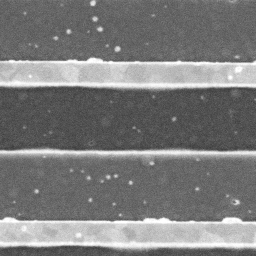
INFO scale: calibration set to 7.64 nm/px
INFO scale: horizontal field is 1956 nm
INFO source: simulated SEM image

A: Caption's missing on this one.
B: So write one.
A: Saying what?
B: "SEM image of lines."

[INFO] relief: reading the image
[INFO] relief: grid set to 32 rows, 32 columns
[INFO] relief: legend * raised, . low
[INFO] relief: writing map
********************************
********************************
********************************
********************************
********************************
********************************
********************************
********************************
********************************
********************************
....****************************
................................
................................
................................
................................
................................
................................
................................
................................
********************************
********************************
********************************
********************************
********************************
********************************
********************************
********************************
********************************
********************************
********************************
.................*..*****.******
................................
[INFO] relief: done